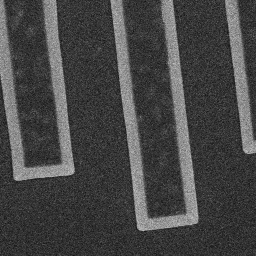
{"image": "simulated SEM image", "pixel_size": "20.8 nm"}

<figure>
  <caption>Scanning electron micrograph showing one or a few lines or trenches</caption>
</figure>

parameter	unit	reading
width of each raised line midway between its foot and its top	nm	1080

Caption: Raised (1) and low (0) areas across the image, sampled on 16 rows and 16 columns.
1110000111100011
1110000111100001
1110000111100001
1110000011100001
1111000011100001
1111000011100001
0111000011100001
0111000011100001
0111000011100001
0111000011110000
0111000011110000
0000000001110000
0000000001110000
0000000001110000
0000000000000000
0000000000000000